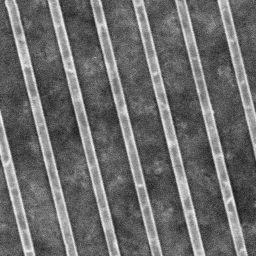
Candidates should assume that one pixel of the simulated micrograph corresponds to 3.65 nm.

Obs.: parallel lines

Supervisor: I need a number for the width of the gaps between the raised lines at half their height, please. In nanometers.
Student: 117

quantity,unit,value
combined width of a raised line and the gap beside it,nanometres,150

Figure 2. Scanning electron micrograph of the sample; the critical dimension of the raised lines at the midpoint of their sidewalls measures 34.1 nanometers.